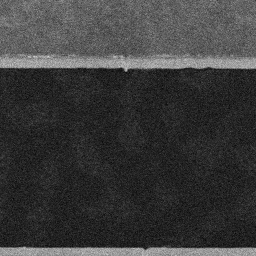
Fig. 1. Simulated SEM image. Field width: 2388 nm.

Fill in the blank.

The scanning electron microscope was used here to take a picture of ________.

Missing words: one or a few lines or trenches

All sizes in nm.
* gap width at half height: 1750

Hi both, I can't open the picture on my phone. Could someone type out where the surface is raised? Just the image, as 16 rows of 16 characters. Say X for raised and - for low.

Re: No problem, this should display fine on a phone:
XXXXXXXXXXXXXXXX
XXXXXXXXXXXXXXXX
XXXXXXXXXXXXXXXX
XXXXXXXXXXXXXXXX
----------------
----------------
----------------
----------------
----------------
----------------
----------------
----------------
----------------
----------------
----------------
----------------